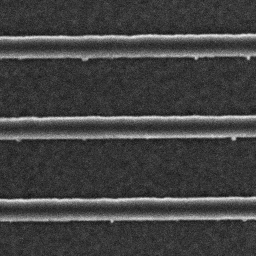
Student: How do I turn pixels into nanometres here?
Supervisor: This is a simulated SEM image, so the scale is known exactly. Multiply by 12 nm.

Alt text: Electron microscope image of lines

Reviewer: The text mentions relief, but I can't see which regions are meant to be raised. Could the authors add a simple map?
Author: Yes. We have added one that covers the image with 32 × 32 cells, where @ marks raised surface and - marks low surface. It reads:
--------------------------------
--------------------------------
--------------------------------
--------------------------------
-------------@---@@@@@@@@@@@@@@@
@@@@@@@@@@@@@@@@@@@@@@@@@@@@@@@@
@@@@@@@@@@@@@@@@@@@@@@@@@@@@@@@@
--------------------------------
--------------------------------
--------------------------------
--------------------------------
--------------------------------
--------------------------------
--------------------------------
--------------------------------
@@@@@@@@@@@@@@@@@@@@@@@@@@@@@@@@
@@@@@@@@@@@@@@@@@@@@@@@@@@@@@@@@
--------------------------------
--------------------------------
--------------------------------
--------------------------------
--------------------------------
--------------------------------
--------------------------------
--------------------------------
@@@@@@@@@@@@@@@@@@@@@@@@@@@@@@@@
@@@@@@@@@@@@@@@@@@@@@@@@@@@@@@@@
@@------------------------------
--------------------------------
--------------------------------
--------------------------------
--------------------------------